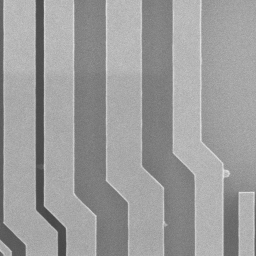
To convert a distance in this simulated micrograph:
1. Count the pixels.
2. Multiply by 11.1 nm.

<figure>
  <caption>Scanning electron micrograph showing groups of lines, slits or small figures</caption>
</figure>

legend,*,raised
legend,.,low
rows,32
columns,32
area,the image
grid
****..***....*****....***.......
****..***....*****....***.......
****..***....*****....***.......
****..***....*****....***.......
.***..***....*****....***.......
****..***....*****....***.......
****..***....*****....***.......
****..***....*****....***.......
****..***....*****....***.......
****..***....*****....***.......
****..***....*****....***.......
****..***....*****....***.......
****..***....*****....***.......
****..***....*****....***.......
.***..***....*****....***.......
.***..***....*****....***.......
.***..***....*****....***.......
****..***....*****....***.......
****..***....*****....****......
****..***....*****....*****.....
****..***....*****.....*****....
****..***....*****......****....
****..***....*******....****....
****..***.....******....****....
****..****.....*****....****..**
****..****......****....****..**
*****.******....****....****..**
******.*****....****....****..**
.******.****....****....****..**
..*****.****....****....****..**
*..****.****....****....****..**
*..****.****....****....****..**